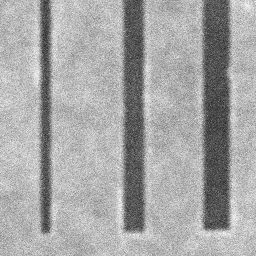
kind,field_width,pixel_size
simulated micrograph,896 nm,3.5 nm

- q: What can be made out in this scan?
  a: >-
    one or a few lines or trenches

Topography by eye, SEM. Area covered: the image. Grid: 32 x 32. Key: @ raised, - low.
@@@@@--@@@@@@@@---@@@@@@@----@@@
@@@@@--@@@@@@@@---@@@@@@@----@@@
@@@@@--@@@@@@@@---@@@@@@@----@@@
@@@@@--@@@@@@@@---@@@@@@@----@@@
@@@@@--@@@@@@@@---@@@@@@@----@@@
@@@@@--@@@@@@@@---@@@@@@@----@@@
@@@@@--@@@@@@@@---@@@@@@@----@@@
@@@@@--@@@@@@@@---@@@@@@@----@@@
@@@@@--@@@@@@@@---@@@@@@@----@@@
@@@@@--@@@@@@@@---@@@@@@@----@@@
@@@@@--@@@@@@@@---@@@@@@@----@@@
@@@@@--@@@@@@@@---@@@@@@@----@@@
@@@@@--@@@@@@@@---@@@@@@@----@@@
@@@@@--@@@@@@@@---@@@@@@@----@@@
@@@@@--@@@@@@@@---@@@@@@@----@@@
@@@@@--@@@@@@@@---@@@@@@@----@@@
@@@@@--@@@@@@@@---@@@@@@@----@@@
@@@@@--@@@@@@@@---@@@@@@@----@@@
@@@@@--@@@@@@@@---@@@@@@@----@@@
@@@@@-@@@@@@@@@---@@@@@@@----@@@
@@@@@--@@@@@@@@---@@@@@@@----@@@
@@@@@--@@@@@@@@---@@@@@@@----@@@
@@@@@--@@@@@@@@---@@@@@@@----@@@
@@@@@--@@@@@@@@---@@@@@@@----@@@
@@@@@--@@@@@@@@---@@@@@@@----@@@
@@@@@--@@@@@@@@---@@@@@@@----@@@
@@@@@--@@@@@@@@---@@@@@@@----@@@
@@@@@--@@@@@@@@---@@@@@@@----@@@
@@@@@--@@@@@@@@---@@@@@@@----@@@
@@@@@@@@@@@@@@@@@@@@@@@@@@@@@@@@
@@@@@@@@@@@@@@@@@@@@@@@@@@@@@@@@
@@@@@@@@@@@@@@@@@@@@@@@@@@@@@@@@